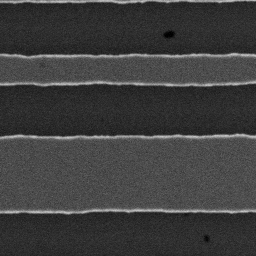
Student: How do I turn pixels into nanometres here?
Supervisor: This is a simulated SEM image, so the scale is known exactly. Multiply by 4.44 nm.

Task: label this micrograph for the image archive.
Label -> lines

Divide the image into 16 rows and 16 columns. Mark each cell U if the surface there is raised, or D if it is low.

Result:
DDDDDDDDDDDDDDDD
DDDDDDDDDDDDDDDD
DDDDDDDDDDDDDDDD
UDUUUUUUUUUUUUUU
UUUUUUUUUUUUUUUU
DDDDDDDDDDDDDDDD
DDDDDDDDDDDDDDDD
DDDDDDDDDDDDDDDD
DUDDDDDDDDUUDUUU
UUUUUUUUUUUUUUUU
UUUUUUUUUUUUUUUU
UUUUUUUUUUUUUUUU
UUUUUUUUUUUUUUUU
DDDDDDDDDDDDDDDD
DDDDDDDDDDDDDDDD
DDDDDDDDDDDDDDDD